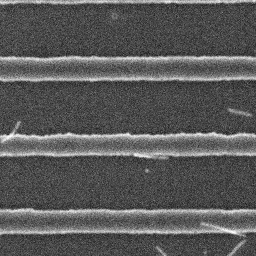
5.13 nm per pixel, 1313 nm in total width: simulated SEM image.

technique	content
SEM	lines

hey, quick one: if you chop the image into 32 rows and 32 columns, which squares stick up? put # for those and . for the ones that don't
................................
................................
................................
................................
................................
................................
................................
################################
################################
################################
................................
................................
................................
................................
................................
................................
................................
################################
################################
.................##.............
................................
................................
................................
................................
................................
................................
################################
################################
################################
................................
................................
................................